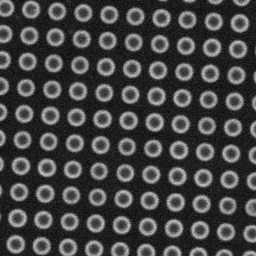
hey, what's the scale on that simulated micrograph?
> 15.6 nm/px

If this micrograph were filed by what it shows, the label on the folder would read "an array of small figures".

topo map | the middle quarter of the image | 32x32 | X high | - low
--XXXX--XXXXX--XXXX---XXX----XXX
--XXXX--XXXXX--XXXX--XXXXX--XXXX
---------XXX---XXXX--XXXX---XXXX
----------------------XXX---XXXX
--------------------------------
--XXX----XX---------------------
-XXXXX--XXXX---XXX----XXX----X--
-XXXXX--XXXX--XXXXX--XXXX---XXXX
--XXX---XXXX---XXXX--XXXX--XXXXX
---------------XXX---XXXX---XXXX
-----------------------------XX-
--XX----------------------------
-XXXX---XXX----XXX----XX--------
-XXXX--XXXXX--XXXX---XXXX---XXX-
-XXXX---XXXX--XXXX---XXXX--XXXX-
--------XXX---XXXX---XXXX--XXXX-
----------------------XX----XXX-
--------------------------------
-XXX----XX----------------------
-XXXX--XXXX---XXX----XXX----XX--
-XXXX--XXXX---XXXX--XXXX---XXXX-
-XXX---XXXX---XXXX--XXXX---XXXX-
---------------XX----XXX---XXXX-
----------------------------XX--
-XX-----------------------------
XXXX---XXX----XX----------------
XXXX---XXXX--XXXX---XXXX---XXX--
XXXX---XXXX--XXXX---XXXX--XXXX--
--X-----XX---XXXX---XXXX--XXXX--
---------------------XX----XXX--
--------------------------------
XXX----XX-----------------------